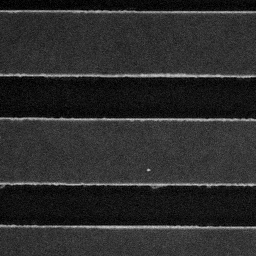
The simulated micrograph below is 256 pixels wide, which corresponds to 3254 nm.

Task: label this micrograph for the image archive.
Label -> lines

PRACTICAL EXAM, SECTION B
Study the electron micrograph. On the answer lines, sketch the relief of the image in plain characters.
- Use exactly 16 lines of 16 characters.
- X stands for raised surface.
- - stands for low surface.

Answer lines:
----------------
XXXXXXXXXXXXXXXX
XXXXXXXXXXXXXXXX
XXXXXXXXXXXXXXXX
XXXXXXXXXXXXXXXX
----------------
----------------
XXXXXXXXXXXXXXX-
XXXXXXXXXXXXXXXX
XXXXXXXXXXXXXXXX
XXXXXXXXXXXXXXXX
X-XXXXXXXXXXXXXX
----------------
----------------
XXXXXXXXXXXXXXXX
XXXXXXXXXXXXXXXX